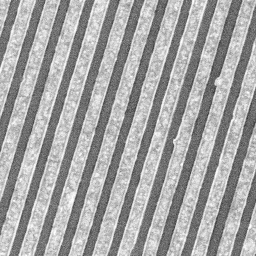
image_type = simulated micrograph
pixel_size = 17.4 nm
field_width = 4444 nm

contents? parallel lines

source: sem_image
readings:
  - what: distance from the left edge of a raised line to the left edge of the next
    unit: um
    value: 0.409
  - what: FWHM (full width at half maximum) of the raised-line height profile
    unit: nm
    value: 225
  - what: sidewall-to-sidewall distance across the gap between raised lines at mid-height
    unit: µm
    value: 0.187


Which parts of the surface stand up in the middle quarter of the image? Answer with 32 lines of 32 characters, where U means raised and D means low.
DDDUUUDDDUUUDDDUUUUDDUUUUDDUUUUD
DDDUUUDDDUUUDDDUUUDDDUUUUDDUUUDD
DDUUUUDDDUUUDDUUUUDDDUUUDDDUUUDD
DDUUUDDDUUUUDDUUUUDDUUUUDDDUUUDD
DDUUUDDDUUUDDDUUUDDDUUUUDDUUUUDD
DUUUUDDDUUUDDDUUUDDDUUUDDDUUUDDD
DUUUUDDUUUUDDUUUUDDUUUUDDDUUUDDD
DUUUDDDUUUDDDUUUUDDUUUUDDUUUUDDD
DUUUDDDUUUDDDUUUDDDUUUDDDUUUDDDU
UUUUDDUUUUDDDUUUDDDUUUDDDUUUDDDU
UUUDDDUUUUDDUUUUDDUUUUDDUUUUDDDU
UUUDDDUUUDDDUUUDDDUUUUDDUUUUDDUU
UUUDDDUUUDDDUUUDDDUUUDDDUUUDDDUU
UUDDDUUUUDDUUUUDDUUUUDDDUUUDDDUU
UUDDDUUUDDDUUUUDDUUUUDDUUUUDDUUU
UUDDDUUUDDDUUUDDDUUUDDDUUUDDDUUU
UUDDUUUUDDUUUUDDDUUUDDDUUUDDDUUU
UDDDUUUDDDUUUUDDUUUUDDUUUUDDDUUU
UDDDUUUDDDUUUDDDUUUUDDUUUDDDUUUU
UDDDUUUDDDUUUDDDUUUDDDUUUDDUUUUD
DDDUUUUDDUUUUDDUUUUDDDUUUDDDUUUD
DDDUUUDDDUUUDDDUUUUDDUUUUDDUUUUD
DDDUUUDDDUUUDDDUUUDDDUUUDDDUUUDD
DDUUUUDDDUUUDDUUUUDDDUUUDDDUUUDD
DDUUUDDDUUUUDDUUUUDDUUUUDDDUUUDD
DDUUUDDDUUUDDDUUUDDDUUUDDDUUUDDD
DUUUUDDDUUUDDDUUUDDDUUUDDDUUUDDD
DUUUDDDUUUUDDUUUUDDUUUUDDDUUUDDD
DUUUDDDUUUDDDUUUUDDUUUDDDUUUUDDD
DUUUDDDUUUDDDUUUDDDUUUDDDUUUDDDU
UUUUDDUUUUDDUUUUDDDUUUDDDUUUDDDU
UUUDDDUUUDDDUUUUDDUUUUDDUUUUDDDU